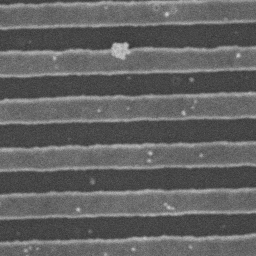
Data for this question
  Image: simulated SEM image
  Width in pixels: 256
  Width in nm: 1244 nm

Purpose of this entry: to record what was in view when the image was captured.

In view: lines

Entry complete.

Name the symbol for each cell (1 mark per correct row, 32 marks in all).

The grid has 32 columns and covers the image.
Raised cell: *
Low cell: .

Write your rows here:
..*..***************************
********************************
********************************
**..............................
................................
..............**................
********************************
********************************
********************************
****............................
................................
................................
********************************
********************************
********************************
*..*............................
................................
................................
....****************************
********************************
********************************
................................
................................
................................
********************************
********************************
********************************
................................
................................
....................*........***
********************************
********************************